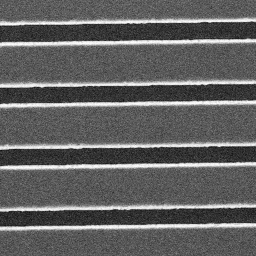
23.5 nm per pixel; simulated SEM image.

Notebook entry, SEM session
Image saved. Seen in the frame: lines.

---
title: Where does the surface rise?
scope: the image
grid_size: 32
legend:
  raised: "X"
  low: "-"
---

XXXXXXXXXXXXXXXXXXXXXXXXXXXXXXXX
XXXXXXXXXXXXXXXXXXXXXXXXXXXXXXXX
XXXXXXXXXXXXXXXXXXXXXXXXXXXXXXXX
--------------------------------
--------------------------------
--XXXXXXXXXXXXXXXXXXXXXXXXXXXXXX
XXXXXXXXXXXXXXXXXXXXXXXXXXXXXXXX
XXXXXXXXXXXXXXXXXXXXXXXXXXXXXXXX
XXXXXXXXXXXXXXXXXXXXXXXXXXXXXXXX
XXXXXXXXXXXXXXXXXXXXXXXXXXXXXXXX
XXXXXXXXXXXXXXXXXXXXXXX---------
--------------------------------
--------------------------------
XXXXXXXXXXXXXXXXXXXXXXXXXXXXXXXX
XXXXXXXXXXXXXXXXXXXXXXXXXXXXXXXX
XXXXXXXXXXXXXXXXXXXXXXXXXXXXXXXX
XXXXXXXXXXXXXXXXXXXXXXXXXXXXXXXX
XXXXXXXXXXXXXXXXXXXXXXXXXXXXXXXX
XXXXX---------------------------
--------------------------------
------------------------------XX
XXXXXXXXXXXXXXXXXXXXXXXXXXXXXXXX
XXXXXXXXXXXXXXXXXXXXXXXXXXXXXXXX
XXXXXXXXXXXXXXXXXXXXXXXXXXXXXXXX
XXXXXXXXXXXXXXXXXXXXXXXXXXXXXXXX
XXXXXXXXXXXXXXXXXXXXXXXXXXXXXXXX
--------------------------------
--------------------------------
-----XXXXXXXXXXXXXXXXXXXXXXXXXXX
XXXXXXXXXXXXXXXXXXXXXXXXXXXXXXXX
XXXXXXXXXXXXXXXXXXXXXXXXXXXXXXXX
XXXXXXXXXXXXXXXXXXXXXXXXXXXXXXXX